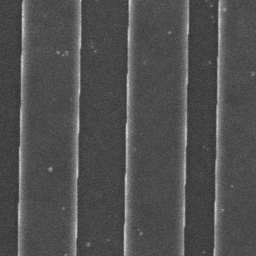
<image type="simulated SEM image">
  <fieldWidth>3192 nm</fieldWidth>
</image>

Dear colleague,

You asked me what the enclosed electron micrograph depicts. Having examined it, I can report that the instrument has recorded lines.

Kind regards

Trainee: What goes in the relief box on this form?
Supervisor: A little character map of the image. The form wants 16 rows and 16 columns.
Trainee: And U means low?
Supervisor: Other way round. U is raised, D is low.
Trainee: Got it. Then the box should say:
DUUUUDDDUUUUDDUU
DUUUUDDDUUUUDDUU
DUUUUDDDUUUUDDUU
DUUUUDDDUUUUDDUU
DUUUUDDDUUUUDDUU
DUUUUDDDUUUUDDUU
DUUUUDDDUUUUDDUU
DUUUUDDDUUUUDDUU
DUUUUDDDUUUUDDUU
DUUUUDDDUUUUDDUU
DUUUUDDDUUUUDDUU
DUUUUDDDUUUUDDUU
DUUUUDDDUUUUDUUU
DUUUUDDDUUUUDUUU
DUUUUDDDUUUUDUUU
DUUUUDDDUUUDDUUU